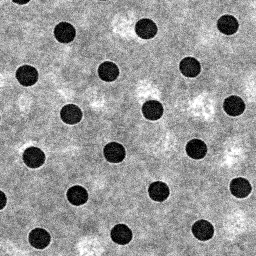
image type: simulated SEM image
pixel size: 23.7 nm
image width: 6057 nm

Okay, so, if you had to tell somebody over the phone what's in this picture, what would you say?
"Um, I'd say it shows a regular array of holes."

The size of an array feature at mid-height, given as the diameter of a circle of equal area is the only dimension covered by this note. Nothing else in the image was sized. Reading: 532 nm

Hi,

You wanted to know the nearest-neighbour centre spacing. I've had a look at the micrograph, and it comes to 1350 nanometers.